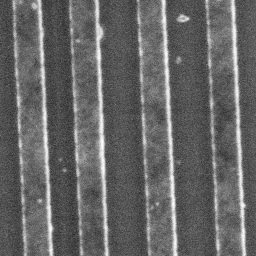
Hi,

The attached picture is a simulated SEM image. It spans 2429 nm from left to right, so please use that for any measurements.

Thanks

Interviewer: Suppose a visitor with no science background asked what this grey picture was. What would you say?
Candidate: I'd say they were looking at lines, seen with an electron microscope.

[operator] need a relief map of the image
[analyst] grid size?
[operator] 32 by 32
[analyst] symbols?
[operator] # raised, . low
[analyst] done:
..###....###.....####.....###...
..###....###.....####.....###...
..###....###.....####.....###...
..###....###.....####.....###...
..###....###.....####.....###...
..###....###......###.....###...
..###....###......###.....###...
..###....###......###.....###...
..###....###......###.....####..
..###....####.....###.....####..
..###....####.....###.....####..
..####...####.....###.....####..
..####...####.....###.....####..
..####...####.....###.....####..
..####...####.....###......###..
..####...####.....###......###..
..####...####.....###......###..
..####...####.....###......###..
..####....###.....###......###..
...###....###.....###......###..
...###....###.....####.....###..
...###....###.....####.....###..
...###....###.....####.....###..
...###....###.....####.....###..
...###....###.....####.....###..
...###....###.....####.....###..
...###....###.....####.....###..
...###....###.....####.....###..
...###....###......###.....###..
...###....###......###.....###..
...###....###......###.....###..
...###....###......###.....####.